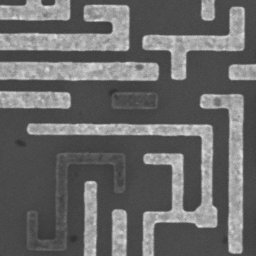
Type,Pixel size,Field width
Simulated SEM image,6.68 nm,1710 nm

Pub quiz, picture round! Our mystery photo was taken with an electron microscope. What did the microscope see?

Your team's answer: wiring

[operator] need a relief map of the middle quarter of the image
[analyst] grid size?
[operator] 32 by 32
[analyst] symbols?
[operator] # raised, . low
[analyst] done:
########################...###..
########################...###..
########################...###..
#######################....###..
................................
................................
................................
#...........###########.........
#...........###########.........
#...........###########.........
#...........###########.........
................................
................................
................................
................................
################################
################################
################################
................................
................................
................................
................................
#######.##......................
###############.....##########..
###############.....##########..
#...........###............###..
#............##............###..
#............##............###..
#............##............###..
#............##............###..
#....###.....##............###..
#....###.....##............###..